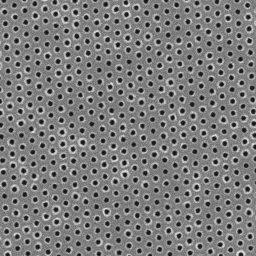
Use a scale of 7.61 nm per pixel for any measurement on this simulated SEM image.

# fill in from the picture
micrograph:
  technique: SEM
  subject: a regular array of holes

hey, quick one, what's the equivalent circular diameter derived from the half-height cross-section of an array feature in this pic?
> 40.3 nm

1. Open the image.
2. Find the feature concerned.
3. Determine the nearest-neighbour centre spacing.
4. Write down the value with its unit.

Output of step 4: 87.4 nm